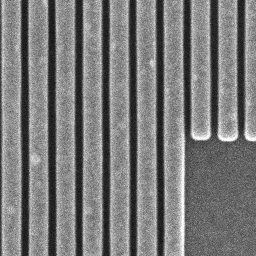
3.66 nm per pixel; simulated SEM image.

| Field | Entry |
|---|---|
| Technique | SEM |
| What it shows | parallel lines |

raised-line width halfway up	71.4	nm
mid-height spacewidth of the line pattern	28.4	nanometers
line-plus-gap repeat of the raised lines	99.1	nm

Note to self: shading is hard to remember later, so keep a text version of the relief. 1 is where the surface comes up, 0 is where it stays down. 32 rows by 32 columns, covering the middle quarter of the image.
11100111100111110011111001111100
11100111100111110011111001111100
11100111100111110011111001111100
11100111100111110011111001111100
11100111100111110011111001111100
11100111100111110011111001111100
11100111100111110011111001111100
11100111100111110011111001111100
11100111100111110011111001111100
11000111100111110011111001111100
11100111100111110011111001111100
11100111100011110011111001111100
11100111100011110011111001111100
11100111100011110011111001111100
11100111100011110011111001111100
11100111100011110011111001111100
11100111100011110011111001111100
11100111100011110011111001111100
11100111110011110001111001111100
11100111110011110001111001111100
11100111110011110001111001111100
11100111110011110001111001111100
11100111110011110001111001111100
11100111110011110001111001111100
11100111110011110001111001111100
11100111110011110001111001111100
11100111110011110001111001111100
11100111100011110011111001111100
11100111100011110011111001111100
11100111100011110011111001111100
11100111100011110011111001111100
11100111100011110011111001111100